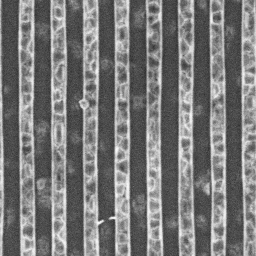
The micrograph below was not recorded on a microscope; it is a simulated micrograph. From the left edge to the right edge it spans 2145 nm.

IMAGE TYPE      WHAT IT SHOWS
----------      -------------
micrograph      parallel lines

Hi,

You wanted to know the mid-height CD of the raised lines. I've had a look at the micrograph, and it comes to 114 nm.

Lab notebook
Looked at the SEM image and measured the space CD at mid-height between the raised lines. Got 147 nm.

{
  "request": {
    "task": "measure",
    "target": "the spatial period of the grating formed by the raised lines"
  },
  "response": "0.267 microns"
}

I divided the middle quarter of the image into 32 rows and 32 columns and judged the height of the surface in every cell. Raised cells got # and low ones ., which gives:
.....###.....###.....###.....###
.....###.....###.....###.....###
.....###.....###.....###.....###
.....###.....###.....###.....###
.....###.....###.....###.....###
.....###.....###.....###.....###
.....###.....###.....###.....###
.....###.....###.....###.....###
.....###.....###.....###.....###
....####.....###.....###.....###
....####.....###.....###.....###
.....###.....###.....###.....###
.....###.....###.....###.....###
.....###.....###.....###.....###
.....###.....###.....###.....###
.....###.....###.....###.....###
.....###.....###.....###.....###
.....###.....###.....###.....###
.....###.....###.....###.....###
.....###.....###.....###.....###
.....###.....###.....###.....###
.....###.....###.....###.....###
.....###.....###.....###.....###
.....###.....###.....###.....###
.....###.....###.....###.....###
.....###.....###.....###.....###
.....###.....###.....###.....###
.....###.....###.....###.....###
.....###.....###.....###.....###
.....###.....###.....###.....###
.....###.....###.....###.....###
.....###.....###.....###.....###